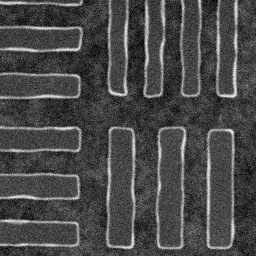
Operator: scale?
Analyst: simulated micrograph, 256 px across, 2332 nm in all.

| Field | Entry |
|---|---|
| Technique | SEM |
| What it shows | groups of lines, slits or small figures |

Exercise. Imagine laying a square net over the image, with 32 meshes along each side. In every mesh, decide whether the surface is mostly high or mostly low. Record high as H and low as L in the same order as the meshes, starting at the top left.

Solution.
LLLLLLLHHHLLLLHHLLHHLLLHHLLHHLLL
LLLLLLLLLLLLLLHHLLHHLLLHHLLHHLLL
LLLLLLLLLLLLLLHHLLHHLLLHHLLHHLLL
HHHHLLLLLLLLLLHHLLHHLLLHHLLHHLLL
HHHHHHHHHHLLLLHHLLHHLLLHHLLHHLLL
HHHHHHHHHHLLLLHHLLHHLLLHHLLHHLLL
LLLLLLLLLLLLLLHHLLHHLLLHHLLHHLLL
LLLLLLLLLLLLLLHHLLHHLLLHHLLHHLLL
LLLLLLLLLLLLLLHHLLHHLLLHHLLHHLLL
HHHHHHHHHHLLLLHHLLHHLLLHHLLHHLLL
HHHHHHHHHHLLLLHHLLHHLLLHHLLHHLLL
HHHHHHHHHHLLLLHHLLHHLLLHHLLHHLLL
LLLLLLLLLLLLLLLLLLLLLLLLLLLLLLLL
LLLLLLLLLLLLLLLLLLLLLLLLLLLLLLLL
LLLLLLLLLLLLLLLLLLLLLLLLLLLLLLLL
LLLLLLLLLLLLLLLLLLLLLLLLLLLLLLLL
HHHHHHHHHHLLLLHHHLLLHHHLLLHHHLLL
HHHHHHHHHHLLLLHHHLLLHHHLLLHHHLLL
HHHHHHHHHHLLLLHHHLLLHHHLLLHHHLLL
LLLLLLLLLLLLLLHHHLLLHHHLLLHHHLLL
LLLLLLLLLLLLLLHHHLLLHHHLLLHHHLLL
LLLLLLLLLLLLLLHHHLLLHHHLLLHHHLLL
HHHHHHHHHHLLLLHHHLLLHHHLLLHHHLLL
HHHHHHHHHHLLLLHHHLLLHHHLLLHHHLLL
HHHHHHHHHHLLLLHHHLLLHHHLLLHHHLLL
LLLLLLLLLLLLLHHHHLLLHHHLLLHHHLLL
LLLLLLLLLLLLLLHHHLLLHHHLLLHHHLLL
LLLLLLLLLLLLLLHHHLLLHHHLLLHHHLLL
HHHHHHHHHHLLLHHHHLLLHHHLLLHHHLLL
HHHHHHHHHHLLLHHHHLLLHHHLLLHHHLLL
HHHHHHHHHHLLLLHHHLLLHHHLLLHHHLLL
LLLLLLLLLLLLLLLLLLLLLLLLLLLLLLLL